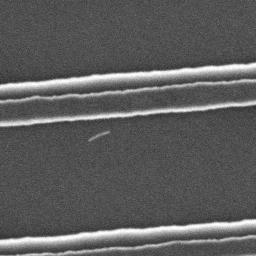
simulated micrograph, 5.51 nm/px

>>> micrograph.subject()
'lines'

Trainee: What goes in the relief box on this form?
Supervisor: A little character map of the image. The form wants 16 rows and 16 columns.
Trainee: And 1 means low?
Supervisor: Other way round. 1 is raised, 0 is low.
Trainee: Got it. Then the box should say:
0000000000000000
0000000000000000
0000000000000000
0000000000000000
0000000000111111
1111111111111111
1111111111111110
1111000000000000
0000000000000000
0000000000000000
0000000000000000
0000000000000000
0000000000000000
0000000000000000
0000000111111111
1111111111111111